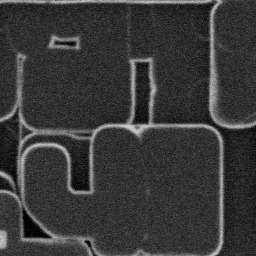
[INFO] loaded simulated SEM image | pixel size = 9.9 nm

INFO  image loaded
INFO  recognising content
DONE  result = wiring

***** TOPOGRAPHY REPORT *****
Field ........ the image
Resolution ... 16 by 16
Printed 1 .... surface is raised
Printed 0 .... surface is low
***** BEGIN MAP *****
0000000000000111
0000000000000111
0000000000000111
0000000000000111
0000000000000111
0000000000000111
0000000000000111
0000000000000111
0000001111111100
0011001111111100
0111001111111100
0111001111111100
1111111111111100
1111111111111100
1001111111111100
1111111111111100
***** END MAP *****